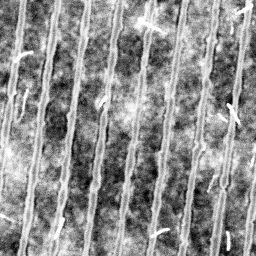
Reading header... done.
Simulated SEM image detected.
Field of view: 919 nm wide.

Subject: parallel lines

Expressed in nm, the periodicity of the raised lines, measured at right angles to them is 114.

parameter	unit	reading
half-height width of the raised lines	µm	0.0239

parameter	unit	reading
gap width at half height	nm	91.9